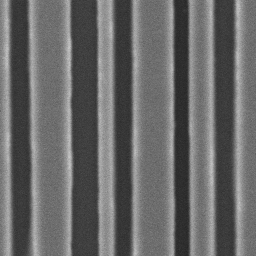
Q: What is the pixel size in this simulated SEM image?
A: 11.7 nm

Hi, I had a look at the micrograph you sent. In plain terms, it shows lines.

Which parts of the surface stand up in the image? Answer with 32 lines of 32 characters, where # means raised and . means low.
#...#####...##...#####..##....##
#...#####...##...#####..##....##
#...#####...##...#####..##....##
#...#####...##...#####..##....##
#...#####...##...#####..##....##
#...#####...##...#####..##....##
#...#####...##...#####..##....##
#...#####...##...#####..##....##
#...#####...##...#####..##....##
#...#####...##...#####..##....##
#...#####...##...#####..##....##
#...#####...##...#####..##....##
#...#####...##...#####..##....##
#...#####...##...#####..##....##
#...#####...##...#####..##....##
#...#####...##...#####..##....##
#...#####...##...#####..###...##
#...#####...##...#####..###...##
#...#####...##...#####..###...##
#...#####...##...#####..###...##
#...#####...##...#####..###...##
#...#####...##...#####..###...##
#...#####...##...#####..###...##
#...#####...##...#####..###...##
#...#####...##...#####..###...##
#...#####...##...#####..###...##
#...#####...##...#####..###...##
#...#####...##...#####..###...##
#...#####...##...#####..###...##
#...#####...##...#####..###...##
#...#####...##...#####..###...##
#...#####...##...#####..###...##